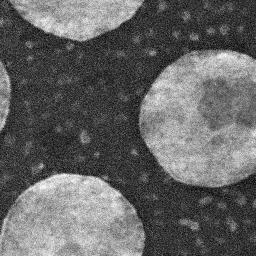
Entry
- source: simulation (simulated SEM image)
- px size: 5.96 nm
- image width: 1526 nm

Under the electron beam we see raised bodies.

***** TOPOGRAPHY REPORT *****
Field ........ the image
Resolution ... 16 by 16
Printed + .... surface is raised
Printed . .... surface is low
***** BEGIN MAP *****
.++++++++.......
..++++++........
................
............+++.
..........++++++
+........+++++++
+........+++++++
.........+++++++
.........+++++++
..........++++++
..........++++++
..+++++.....++..
.+++++++........
+++++++++.......
+++++++++.......
+++++++++.......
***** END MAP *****